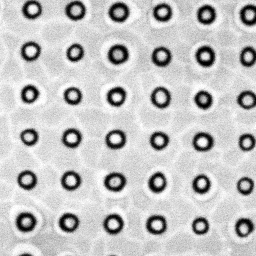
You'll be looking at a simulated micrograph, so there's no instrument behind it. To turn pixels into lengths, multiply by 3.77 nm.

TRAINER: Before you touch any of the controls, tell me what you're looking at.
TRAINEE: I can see a regular array of ring-shaped grooves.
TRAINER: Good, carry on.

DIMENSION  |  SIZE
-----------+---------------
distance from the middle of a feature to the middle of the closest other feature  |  157 nanometres